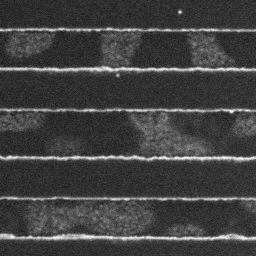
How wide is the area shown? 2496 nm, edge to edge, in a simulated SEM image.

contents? lines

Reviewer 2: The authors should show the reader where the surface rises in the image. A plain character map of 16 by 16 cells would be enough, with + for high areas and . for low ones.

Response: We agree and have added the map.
++++++++++++++++
++++++++++++++++
................
................
++++++++++++++++
++++++++++++++++
++++++++++++++++
................
................
................
++++++++++++++++
++++++++++++++++
................
................
................
++++++++++++++++